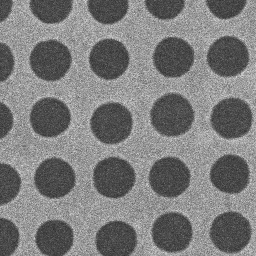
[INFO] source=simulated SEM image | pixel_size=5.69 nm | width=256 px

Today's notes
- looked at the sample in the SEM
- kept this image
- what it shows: a regular array of holes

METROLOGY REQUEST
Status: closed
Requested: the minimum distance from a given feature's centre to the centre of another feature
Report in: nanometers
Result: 319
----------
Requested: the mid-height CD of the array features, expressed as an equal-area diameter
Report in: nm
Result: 234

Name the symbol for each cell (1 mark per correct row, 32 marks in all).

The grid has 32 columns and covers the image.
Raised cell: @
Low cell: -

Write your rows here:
--@@-----@@-----@@-----@@@-----@
-@@@-----@@-----@@@----@@@----@@
@@@@@---@@@@---@@@@@@@@@@@@@@@@@
@@@@@@@@@@@@@@@@@@@@@@@@@@@@@@@@
@@@@@@@@@@@@@@@@@@@@@@@@@@@@@@@@
-@@@@---@@@@---@@@@@----@@@----@
-@@@-----@@-----@@@-----@@-----@
--@@-----@@-----@@@-----@@-----@
--@@-----@@-----@@@-----@@-----@
-@@@@---@@@@---@@@@@@-@@@@@@-@@@
@@@@@@@@@@@@@@@@@@@@@@@@@@@@@@@@
@@@@@@@@@@@@@@@@@@@@@@@@@@@@@@@@
@@@@@--@@@@@@@@@@@@@---@@@@@--@@
-@@@----@@@@----@@@-----@@@----@
--@@-----@@@----@@@-----@@------
--@@-----@@------@@-----@@-----@
-@@@----@@@@----@@@@---@@@@----@
@@@@@@@@@@@@---@@@@@@@@@@@@@@@@@
@@@@@@@@@@@@@@@@@@@@@@@@@@@@@@@@
@@@@@@@@@@@@@@@@@@@@@@@@@@@@--@@
-@@@@----@@@----@@@----@@@@----@
--@@-----@@@-----@@-----@@-----@
---@-----@@@-----@@-----@@-----@
---@@----@@@----@@@----@@@@----@
--@@@@--@@@@@--@@@@@--@@@@@@@@@@
-@@@@@@@@@@@@@@@@@@@@@@@@@@@@@@@
@@@@@@@@@@@@@@@@@@@@@@@@@@@@-@@@
-@@@@@@@@@@@@@@@@@@@----@@@----@
--@@@----@@@@----@@-----@@-----@
--@@-----@@@-----@@-----@@-----@
--@@@----@@@-----@@-----@@@----@
--@@@---@@@@-----@@@@-@@@@@@--@@